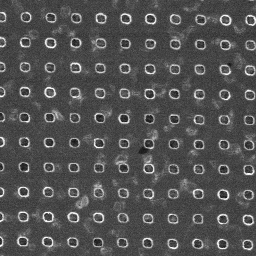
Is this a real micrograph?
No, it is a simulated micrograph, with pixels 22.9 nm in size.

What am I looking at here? a regular array of holes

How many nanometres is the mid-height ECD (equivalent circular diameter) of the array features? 199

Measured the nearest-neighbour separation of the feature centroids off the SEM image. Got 24.7 px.